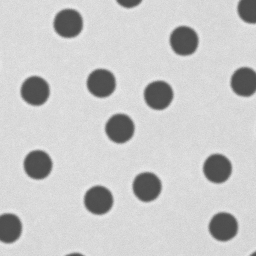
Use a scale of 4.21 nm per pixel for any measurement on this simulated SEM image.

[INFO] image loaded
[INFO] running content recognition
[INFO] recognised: a regular array of holes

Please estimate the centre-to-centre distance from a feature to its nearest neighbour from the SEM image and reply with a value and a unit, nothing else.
246 nanometres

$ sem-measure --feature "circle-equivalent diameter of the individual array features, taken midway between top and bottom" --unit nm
122